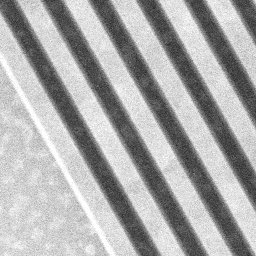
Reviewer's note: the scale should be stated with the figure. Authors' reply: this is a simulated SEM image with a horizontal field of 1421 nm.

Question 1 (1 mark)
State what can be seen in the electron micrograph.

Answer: parallel lines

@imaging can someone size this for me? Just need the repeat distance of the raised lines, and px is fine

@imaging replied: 41.2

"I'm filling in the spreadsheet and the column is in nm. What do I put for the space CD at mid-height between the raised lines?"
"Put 104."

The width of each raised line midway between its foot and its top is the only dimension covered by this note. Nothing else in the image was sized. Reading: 123 nanometres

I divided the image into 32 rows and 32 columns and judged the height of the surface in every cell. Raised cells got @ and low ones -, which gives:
--@@@---@@@---@@@---@@@---@@@---
---@@@---@@@---@@@---@@@---@@@--
@--@@@@--@@@@--@@@---@@@---@@@--
@---@@@---@@@---@@@---@@@---@@@-
@@--@@@@--@@@@--@@@@--@@@@--@@@-
@@---@@@---@@@---@@@---@@@---@@@
@@@---@@@---@@@--@@@@--@@@@--@@@
@@@---@@@---@@@---@@@---@@@---@@
-@@@---@@@---@@@---@@@--@@@@--@@
-@@@@--@@@---@@@---@@@---@@@---@
--@@@---@@@---@@@---@@@---@@@---
---@@@--@@@@--@@@@--@@@---@@@---
---@@@---@@@---@@@---@@@---@@@--
----@@@---@@@---@@@--@@@@--@@@@-
----@@@---@@@---@@@---@@@---@@@-
-----@@@---@@@---@@@---@@@--@@@@
-----@@@@--@@@---@@@---@@@---@@@
------@@@---@@@---@@@---@@@---@@
-------@@@--@@@@--@@@@--@@@---@@
-------@@@---@@@---@@@---@@@---@
--------@@@---@@@---@@@--@@@@--@
--------@@@---@@@---@@@---@@@---
---------@@@---@@@---@@@---@@@--
---------@@@@--@@@---@@@---@@@--
----------@@@---@@@---@@@---@@@-
-----------@@@--@@@@--@@@@--@@@-
-----------@@@---@@@---@@@---@@@
------------@@@---@@@---@@@--@@@
------------@@@---@@@---@@@---@@
-------------@@@---@@@---@@@---@
-------------@@@@--@@@---@@@---@
--------------@@@---@@@---@@@---